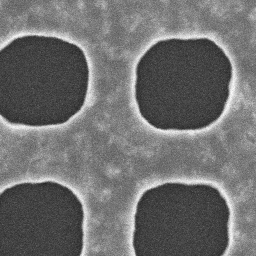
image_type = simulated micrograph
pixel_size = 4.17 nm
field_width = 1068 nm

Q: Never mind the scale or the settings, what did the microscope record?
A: holes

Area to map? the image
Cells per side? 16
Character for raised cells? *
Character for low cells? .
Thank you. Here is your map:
****************
****************
*...******...***
.....****.....**
......***......*
.....***......**
.....****.....**
....*****.....**
****************
****************
****************
*...******...***
.....****.....**
.....***......**
.....***......**
.....***......**